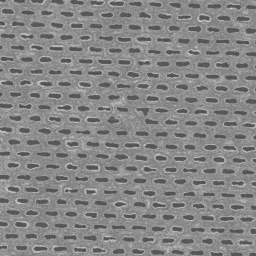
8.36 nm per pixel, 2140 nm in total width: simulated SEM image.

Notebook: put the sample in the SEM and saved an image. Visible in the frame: a regular array of holes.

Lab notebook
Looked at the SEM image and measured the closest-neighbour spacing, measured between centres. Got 123 nanometers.